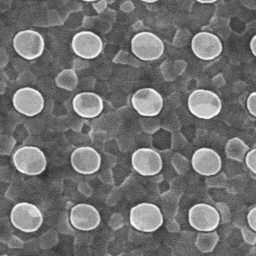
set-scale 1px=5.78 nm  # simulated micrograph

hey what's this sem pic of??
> a regular array of raised bodies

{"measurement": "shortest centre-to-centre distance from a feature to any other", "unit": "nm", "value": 323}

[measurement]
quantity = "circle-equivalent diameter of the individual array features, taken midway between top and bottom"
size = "0.164 um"